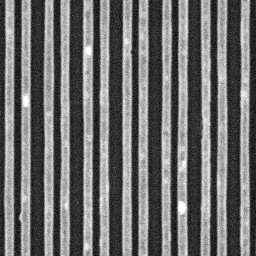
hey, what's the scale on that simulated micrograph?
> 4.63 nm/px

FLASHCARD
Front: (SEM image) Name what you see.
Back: parallel lines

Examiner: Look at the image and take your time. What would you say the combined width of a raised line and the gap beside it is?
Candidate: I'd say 90.9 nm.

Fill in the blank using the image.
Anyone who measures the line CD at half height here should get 8.38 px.